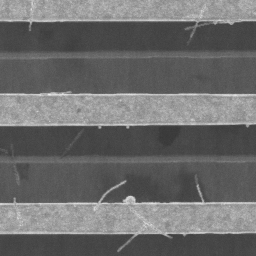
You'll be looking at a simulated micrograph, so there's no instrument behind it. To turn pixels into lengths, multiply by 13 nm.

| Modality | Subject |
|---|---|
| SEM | lines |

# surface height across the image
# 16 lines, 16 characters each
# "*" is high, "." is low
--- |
****************
................
................
..............**
****************
****************
****************
****************
................
................
****************
****************
****************
****************
****************
................